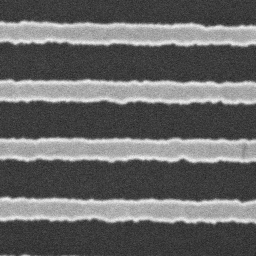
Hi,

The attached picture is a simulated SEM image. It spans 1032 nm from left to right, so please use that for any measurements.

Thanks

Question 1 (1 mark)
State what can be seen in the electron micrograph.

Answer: lines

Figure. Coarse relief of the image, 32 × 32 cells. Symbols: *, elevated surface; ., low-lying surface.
................................
................................
................................
********************************
********************************
.........*****.******.**********
................................
................................
................................
................................
********************************
********************************
****.***************************
................................
................................
................................
................................
*******************..*******..*.
********************************
********************************
................................
................................
................................
................................
................................
********************************
********************************
*.....**.....***.*.*************
................................
................................
................................
................................